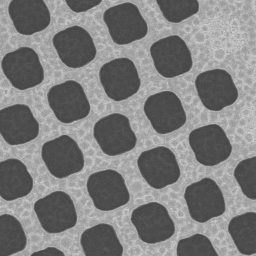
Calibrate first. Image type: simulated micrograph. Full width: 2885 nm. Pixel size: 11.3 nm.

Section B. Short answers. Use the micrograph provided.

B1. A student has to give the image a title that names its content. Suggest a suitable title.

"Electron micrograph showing a regular array of holes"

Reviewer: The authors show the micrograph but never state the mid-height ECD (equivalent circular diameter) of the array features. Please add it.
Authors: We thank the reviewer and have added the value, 0.463 um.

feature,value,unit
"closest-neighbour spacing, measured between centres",0.625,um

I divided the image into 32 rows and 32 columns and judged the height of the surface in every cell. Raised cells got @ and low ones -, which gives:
@-----@@----@@@--@@@-----@@@@@@@
@-----@@@@@@@----@@@-----@@@@@@@
@-----@@@@@@@-----@@@--@@@@@@@@@
@@----@@@-@@@@----@@@@@@@@@@@@@@
@@@@@@@----@@@----@@@-@@@@@@@@@@
@@@@@@@-----@@@-@@@----@@@@@@@@@
@---@@@-----@@@@@@@-----@@@@@@@@
-----@@@---@@@--@@@-----@@@@@@@@
-----@@@@@@@@----@@-----@@@@@@@@
@----@@@@@@@-----@@@--@@@----@@@
@----@@@--@@@----@@@@@@@-----@@@
@@@@@@-----@@----@@@-@@@@-----@@
@@@@@@-----@@@-@@@----@@@----@@@
@---@@-----@@@@@@@-----@@@--@@@@
----@@@----@@---@@-----@@@@@@@@@
-----@@@@@@@----@@@----@@@@@@@@@
-----@@@@@@@-----@@@-@@@----@@@@
@---@@@--@@@-----@@@@@@@-----@@@
@@@@@-----@@@----@@--@@@-----@@@
@@@@@-----@@@@@@@-----@@-----@@@
---@@@----@@@@@@@-----@@@--@@@--
----@@----@@---@@@----@@@@@@@---
----@@@@@@@----@@@----@@@--@@@--
----@@@@@@@-----@@@-@@@----@@@--
---@@@---@@-----@@@@@@@-----@@@-
@@@@-----@@@----@@--@@@-----@@@@
@@@@------@@@@@@@----@@@----@@@@
--@@@-----@@@@@@-----@@@--@@@---
---@@----@@---@@@-----@@@@@@@---
---@@@@@@@-----@@----@@@--@@@---
---@@@@@@@-----@@@@@@@----@@@---
--@@----@@@----@@@@@@@-----@@@--